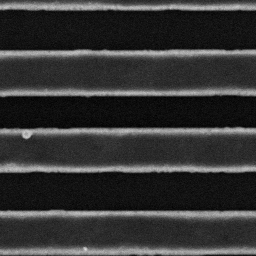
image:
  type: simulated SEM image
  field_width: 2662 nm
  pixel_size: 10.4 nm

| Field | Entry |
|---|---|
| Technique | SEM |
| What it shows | lines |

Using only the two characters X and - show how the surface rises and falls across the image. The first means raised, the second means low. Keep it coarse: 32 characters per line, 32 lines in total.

XXXXXXXXXXXXXXXXXXXXXXXXXXXXXXXX
--------------------------------
--------------------------------
--------------------------------
--------------------------------
--------------------------------
XXXXXXXXXXXXXXXXXXXXXXXXXXXXXXXX
XXXXXXXXXXXXXXXXXXXXXXXXXXXXXXXX
XXXXXXXXXXXXXXXXXXXXXXXXXXXXXXXX
XXXXXXXXXXXXXXXXXXXXXXXXXXXXXXXX
XXXXXXXXXXXXXXXXXXXXXXXXXXXXXXXX
XXXXXXXXXXXXXXXXXXXXXXXXXXXXXXXX
--------------------------------
--------------------------------
--------------------------------
--------------------------------
XXXXXXXXXXXXXXXXXXXXXXXXXXXXXXXX
XXXXXXXXXXXXXXXXXXXXXXXXXXXXXXXX
XXXXXXXXXXXXXXXXXXXXXXXXXXXXXXXX
XXXXXXXXXXXXXXXXXXXXXXXXXXXXXXXX
XXXXXXXXXXXXXXXXXXXXXXXXXXXXXXXX
--------------------------------
--------------------------------
--------------------------------
--------------------------------
--------------------------------
------XX------------------------
XXXXXXXXXXXXXXXXXXXXXXXXXXXXXXXX
XXXXXXXXXXXXXXXXXXXXXXXXXXXXXXXX
XXXXXXXXXXXXXXXXXXXXXXXXXXXXXXXX
XXXXXXXXXXXXXXXXXXXXXXXXXXXXXXXX
XXXXXXXXXXXXXXXXXXXXXXXXXXXXXXXX